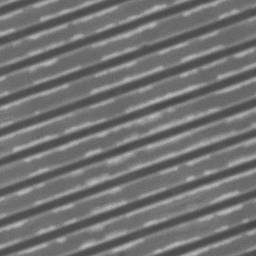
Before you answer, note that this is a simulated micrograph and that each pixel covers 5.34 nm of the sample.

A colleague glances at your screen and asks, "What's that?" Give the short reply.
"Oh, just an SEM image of parallel lines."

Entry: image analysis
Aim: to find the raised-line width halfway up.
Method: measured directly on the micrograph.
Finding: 102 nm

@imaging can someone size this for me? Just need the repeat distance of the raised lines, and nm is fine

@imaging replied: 152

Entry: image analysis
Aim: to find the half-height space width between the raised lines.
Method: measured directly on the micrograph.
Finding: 0.051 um